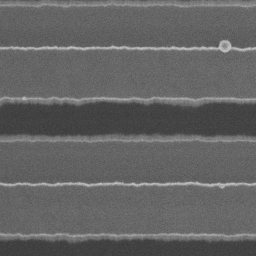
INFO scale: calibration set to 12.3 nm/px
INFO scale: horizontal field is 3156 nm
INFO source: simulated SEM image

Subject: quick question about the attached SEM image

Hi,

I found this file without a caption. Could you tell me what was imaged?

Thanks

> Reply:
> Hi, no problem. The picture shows lines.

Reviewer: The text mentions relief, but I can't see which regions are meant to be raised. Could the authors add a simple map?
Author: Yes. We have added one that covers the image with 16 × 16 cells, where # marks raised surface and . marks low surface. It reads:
################
################
################
################
################
################
................
................
................
################
################
################
################
################
################
................